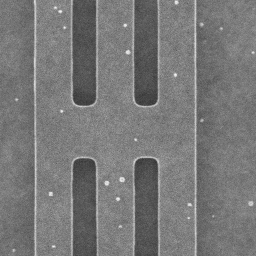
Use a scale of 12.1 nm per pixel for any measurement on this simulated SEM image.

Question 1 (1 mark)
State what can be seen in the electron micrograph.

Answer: groups of lines, slits or small figures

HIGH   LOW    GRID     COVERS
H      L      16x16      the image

LLHHLLHHLLHHLLLL
LLHHLLHHLLHHLLLL
LLHHLLHHLLHHLLLL
LLHHLLHHLLHHLLLL
LLHHLLHHLLHHLLLL
LLHHLLHHLLHHLLLL
LLHHHLHHHLHHLLLL
LLHHHHHHHHHHLLLL
LLHHHHHHHHHHLLLL
LLHHHHHHHHHHLLLL
LLHHHLHHLLHHLLLL
LLHHLLHHLLHHLLLL
LLHHLLHHLLHHLLLL
LLHHLLHHLLHHLLLL
LLHHLLHHLLHHLLLL
LLHHLLHHLLHHLLLL